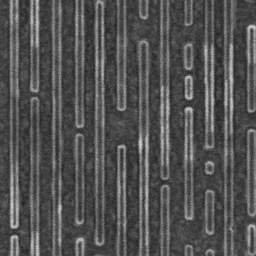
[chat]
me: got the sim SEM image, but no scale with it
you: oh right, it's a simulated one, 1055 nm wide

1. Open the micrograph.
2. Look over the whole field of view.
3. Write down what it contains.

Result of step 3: parallel lines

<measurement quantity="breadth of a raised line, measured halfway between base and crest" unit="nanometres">31.4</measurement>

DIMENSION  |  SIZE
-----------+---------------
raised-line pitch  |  88.3 nanometers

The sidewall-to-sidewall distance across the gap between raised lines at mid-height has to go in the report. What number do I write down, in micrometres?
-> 0.0587